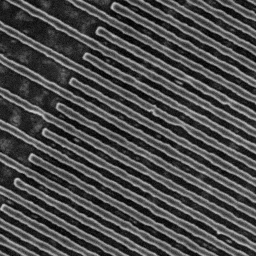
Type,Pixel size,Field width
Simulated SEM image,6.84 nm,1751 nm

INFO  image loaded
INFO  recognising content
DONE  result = parallel lines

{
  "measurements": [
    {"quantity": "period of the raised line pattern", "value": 98.4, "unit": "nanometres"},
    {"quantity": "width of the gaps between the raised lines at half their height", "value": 45.8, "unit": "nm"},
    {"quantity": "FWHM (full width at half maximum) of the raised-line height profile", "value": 51.7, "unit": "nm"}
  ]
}